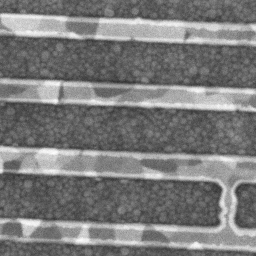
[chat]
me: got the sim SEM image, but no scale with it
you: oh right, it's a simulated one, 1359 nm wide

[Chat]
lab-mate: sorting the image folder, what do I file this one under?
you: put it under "one or a few lines or trenches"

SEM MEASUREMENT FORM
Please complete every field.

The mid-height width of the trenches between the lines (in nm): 265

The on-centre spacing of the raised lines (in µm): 0.363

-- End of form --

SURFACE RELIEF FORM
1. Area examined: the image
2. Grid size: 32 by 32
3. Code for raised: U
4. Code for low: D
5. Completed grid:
DDDDDDDDDDDDDDDDDDDDDDDDDDDDDDDD
DDDDDDDDDDDDDDDDDDDDDDDDDDDDDDDD
UUUUUUUUUUUDDDDDDDDDDDDDDDDDDDDD
UUUUUUUUUUUUUUUUUUUUUUUUUUUUUUUU
DDDDDDDDDDUUUUUUUUUUUUUUUUUUUUUU
DDDDDDDDDDDDDDDDDDDDDDDDDDDDDDDD
DDDDDDDDDDDDDDDDDDDDDDDDDDDDDDDD
DDDDDDDDDDDDDDDDDDDDDDDDDDDDDDDD
DDDDDDDDDDDDDDDDDDDDDDDDDDDDDDDD
DDDDDDDDDDDDDDDDDDDDDDDDDDDDDDDD
UUUUUUUUUDDDDDDDDDDDDDDDDDDDDDDD
UUUUUUUUUUUUUUUUUUUUUUUUUUUUUUUU
DDDDDUUUUUUUUUUUUUUUUUUUUUUUUUUU
DDDDDDDDDDDDDDDDDDDDDDDDDDDDDUUU
DDDDDDDDDDDDDDDDDDDDDDDDDDDDDDDD
DDDDDDDDDDDDDDDDDDDDDDDDDDDDDDDD
DDDDDDDDDDDDDDDDDDDDDDDDDDDDDDDD
DDDDDDDDDDDDDDDDDDDDDDDDDDDDDDDD
DDDDDDDDDDDDDDDDDDDDDDDDDDDDDDDD
UUUUUUUUUUUUUUUUUUUUUDDDDDDDDDDD
UUUUUUUUUUUUUUUUUUUUUUUUUUUUUUUU
DDDDDDUUUUUUUUUUUUUUUUUUUUUUUUUU
DDDDDDDDDDDDDDDDDDDDDDDDDDDUUUUU
DDDDDDDDDDDDDDDDDDDDDDDDDDDDUDDD
DDDDDDDDDDDDDDDDDDDDDDDDDDDDUDDD
DDDDDDDDDDDDDDDDDDDDDDDDDDDDUDDD
DDDDDDDDDDDDDDDDDDDDDDDDDDDDUDDD
DDDDDDDDDDDDDDDDDDDDDDDDDDDDUDDD
UUUUUUUUUUUUUUUUUUUUDDDDDDDUUUDD
UUUUUUUUUUUUUUUUUUUUUUUUUUUUUUUU
DDDDDDDDDDDDDDDDDDUUUUUUUUUUUUUU
DDDDDDDDDDDDDDDDDDDDDDDDDDDDDDDD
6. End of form